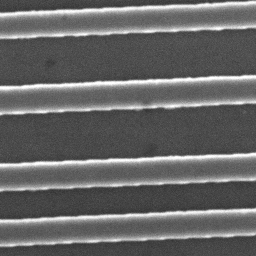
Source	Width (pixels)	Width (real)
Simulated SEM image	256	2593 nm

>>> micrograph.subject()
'lines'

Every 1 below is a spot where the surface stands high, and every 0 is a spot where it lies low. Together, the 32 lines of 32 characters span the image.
00000000000000000000000000111111
00000011111111111111111111111111
11111111111111111111111111111111
11111111111111111111111111111110
11111000000000000000000000000000
00000000000000000000000000000000
00000000000000000000000000000000
00000000000000000000000000000000
00000000000000000000000000000000
00000000000000000000000000000000
00000000111111111111111111111111
11111111111111111111111111111111
11111111111111111111111111111111
11111111111111111000000000000000
00000000000000000000000000000000
00000000000000000000000000000000
00000000000000000000000000000000
00000000000000000000000000000000
00000000000000000000000000000000
00000000000000000000000001111111
00011111111111111111111111111111
11111111111111111111111111111111
11111111111111111111111111111111
11111100000000000000000000000000
00000000000000000000000000000000
00000000000000000000000000000000
00000000000000000000001111111111
00011111111111111111111111111111
11111111111111111111111111111111
11111111111111111111111111100000
11110000000000000000000000000000
00000000000000000000000000000000